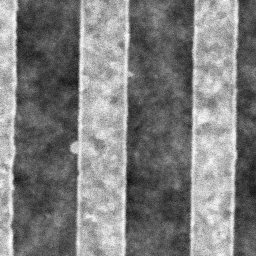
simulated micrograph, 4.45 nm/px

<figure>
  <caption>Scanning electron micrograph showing one or a few lines or trenches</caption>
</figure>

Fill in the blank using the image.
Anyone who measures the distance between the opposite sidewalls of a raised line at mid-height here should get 191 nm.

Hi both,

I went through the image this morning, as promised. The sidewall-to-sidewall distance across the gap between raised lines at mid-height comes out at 302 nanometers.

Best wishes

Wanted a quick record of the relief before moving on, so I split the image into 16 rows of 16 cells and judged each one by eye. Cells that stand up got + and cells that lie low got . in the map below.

+....+++....+++.
+....+++....+++.
+....+++....+++.
+....+++....+++.
+....+++....+++.
+....+++....+++.
+....+++....+++.
+....+++....+++.
+....+++....+++.
+....+++....+++.
+....+++....+++.
+....+++....+++.
+....+++....+++.
+....+++....++..
+....+++....++..
+....+++....++..